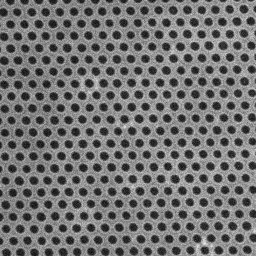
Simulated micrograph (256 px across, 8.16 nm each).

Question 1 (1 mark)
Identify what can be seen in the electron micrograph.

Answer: a regular array of holes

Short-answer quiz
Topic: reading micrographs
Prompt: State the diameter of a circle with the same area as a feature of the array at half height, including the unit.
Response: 79.2 nm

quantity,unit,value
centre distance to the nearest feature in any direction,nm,112